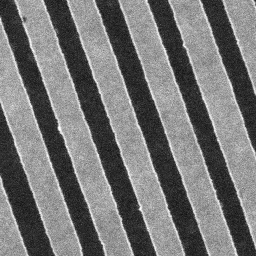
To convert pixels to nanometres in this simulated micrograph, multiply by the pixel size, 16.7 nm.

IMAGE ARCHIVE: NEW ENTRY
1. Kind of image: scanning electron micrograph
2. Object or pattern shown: parallel lines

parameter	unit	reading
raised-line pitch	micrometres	0.81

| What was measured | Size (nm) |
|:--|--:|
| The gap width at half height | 358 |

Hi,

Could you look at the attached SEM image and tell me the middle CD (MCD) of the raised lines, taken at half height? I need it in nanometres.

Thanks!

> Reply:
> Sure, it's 446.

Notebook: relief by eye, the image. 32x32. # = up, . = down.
..####...###...####..####...####
..####...###...####...####..####
...###...####...###...####...###
...####...###...####..####...###
#..####...###...####...####..###
#...###...####...###...####...##
##..####...###...####..####...##
##...###...####...###...####...#
##...###...####...###...####...#
##...####...###...####..####...#
###...###...####..####...####...
###...###...####...###...####...
####..####...###...####..####...
####...###...####...###...####..
.###...###....###...###...####..
.####..####...###...####...####.
.####...###...####...###...####.
..###...####...###...####..####.
..####..####...###...####...####
..####...###...####...###...####
...###...####...###...####..####
...####..####...###...####...###
....###...###...####...###...###
....###...####...###...####..###
#...####...###...####..####...##
#....###...###...####...####..##
#....####..####...###...####...#
##...####...###...####...###...#
##....###...###...####...###...#
###...####..####...###...####..#
###...####...###...####...###...
###....###...####...###...####..